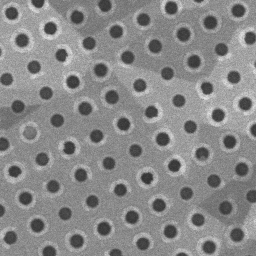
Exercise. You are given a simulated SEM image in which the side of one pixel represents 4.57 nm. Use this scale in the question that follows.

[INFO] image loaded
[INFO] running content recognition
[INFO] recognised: a regular array of holes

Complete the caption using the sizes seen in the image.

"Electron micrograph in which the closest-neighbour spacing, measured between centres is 133 nm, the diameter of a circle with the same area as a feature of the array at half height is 64.9 nm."